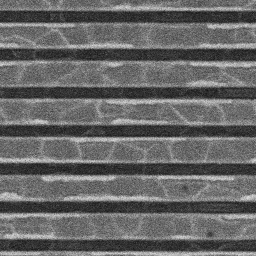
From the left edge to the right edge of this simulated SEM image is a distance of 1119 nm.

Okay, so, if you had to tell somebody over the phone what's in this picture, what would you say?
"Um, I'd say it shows parallel lines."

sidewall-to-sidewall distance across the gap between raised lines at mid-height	12.6	px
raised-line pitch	166	nanometers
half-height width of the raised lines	0.11	µm